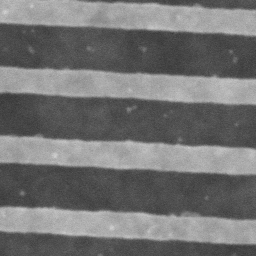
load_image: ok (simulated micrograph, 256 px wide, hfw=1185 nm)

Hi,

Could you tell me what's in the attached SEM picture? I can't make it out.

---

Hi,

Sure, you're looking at lines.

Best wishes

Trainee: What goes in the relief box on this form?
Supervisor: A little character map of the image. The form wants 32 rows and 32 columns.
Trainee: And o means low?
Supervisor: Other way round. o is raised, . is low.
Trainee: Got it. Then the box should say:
oooooooooooooooooooo............
oooooooooooooooooooooooooooooooo
oooooooooooooooooooooooooooooooo
...............ooooooooooooooooo
................................
................................
................................
................................
ooo.............................
oooooooooooooooooooooo..........
oooooooooooooooooooooooooooooooo
oooooooooooooooooooooooooooooooo
.....................ooooooooooo
................................
................................
................................
................................
ooooooo.........................
ooooooooooooooooooooooooooooo...
oooooooooooooooooooooooooooooooo
.......ooooooooooooooooooooooooo
.......................ooooooooo
................................
................................
................................
................................
oooooooooooooo..................
oooooooooooooooooooooooooooooo..
oooooooooooooooooooooooooooooooo
...........ooooooooooooooooooooo
................................
................................